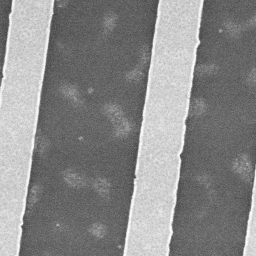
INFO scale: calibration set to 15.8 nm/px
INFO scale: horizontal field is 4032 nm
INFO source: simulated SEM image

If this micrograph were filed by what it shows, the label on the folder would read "one or a few lines or trenches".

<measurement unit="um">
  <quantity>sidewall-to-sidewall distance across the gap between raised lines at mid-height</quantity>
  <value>1.68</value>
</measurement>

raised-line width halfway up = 41.7 pixels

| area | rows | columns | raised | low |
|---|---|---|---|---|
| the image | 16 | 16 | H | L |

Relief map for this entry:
LHHLLLLLLLHHHLLL
LHHLLLLLLLHHLLLL
LHHLLLLLLLHHLLLL
HHHLLLLLLLHHLLLL
HHHLLLLLLHHHLLLL
HHHLLLLLLHHHLLLL
HHLLLLLLLHHHLLLL
HHLLLLLLLHHHLLLL
HHLLLLLLLHHLLLLL
HHLLLLLLLHHLLLLL
HHLLLLLLLHHLLLLL
HHLLLLLLHHHLLLLL
HHLLLLLLHHHLLLLL
HLLLLLLLHHHLLLLL
HLLLLLLLHHHLLLLH
HLLLLLLLHHHLLLLH